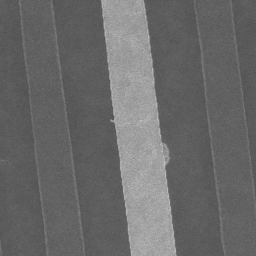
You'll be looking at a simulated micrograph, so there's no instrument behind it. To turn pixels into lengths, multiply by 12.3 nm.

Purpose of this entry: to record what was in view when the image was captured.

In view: lines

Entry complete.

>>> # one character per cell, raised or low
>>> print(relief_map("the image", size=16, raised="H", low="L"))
LHHLLLHHHLLLHHLL
LHHLLLLHHLLLHHHL
LHHHLLLHHLLLHHHL
LLHHLLLHHLLLLHHL
LLHHLLLHHHLLLHHL
LLHHLLLHHHLLLHHL
LLHHLLLHHHLLLHHL
LLHHLLLHHHLLLHHL
LLHHLLLHHHLLLHHH
LLHHHLLHHHLLLHHH
LLHHHLLLHHLLLHHH
LLHHHLLLHHLLLLHH
LLLHHLLLHHHLLLHH
LLLHHLLLHHHLLLHH
LLLHHLLLHHHLLLHH
LLLHHLLLHHHLLLHH